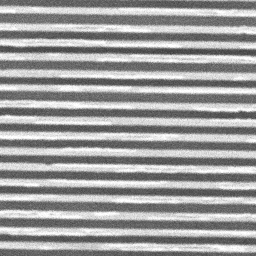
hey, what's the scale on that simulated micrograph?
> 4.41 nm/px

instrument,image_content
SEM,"parallel lines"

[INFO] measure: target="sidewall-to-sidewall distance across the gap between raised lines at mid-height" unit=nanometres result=38.6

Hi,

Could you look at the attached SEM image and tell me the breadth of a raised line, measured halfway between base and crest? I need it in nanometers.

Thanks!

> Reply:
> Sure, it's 30.9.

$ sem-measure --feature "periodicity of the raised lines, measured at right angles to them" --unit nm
69.3